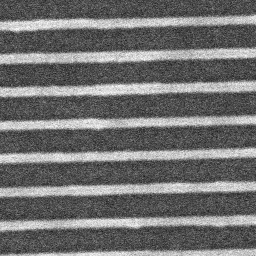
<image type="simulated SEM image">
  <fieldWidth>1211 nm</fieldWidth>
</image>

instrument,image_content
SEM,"parallel lines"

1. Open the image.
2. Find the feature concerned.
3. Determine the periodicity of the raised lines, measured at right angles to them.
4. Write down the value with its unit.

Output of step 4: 158 nanometers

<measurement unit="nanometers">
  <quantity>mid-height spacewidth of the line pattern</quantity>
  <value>116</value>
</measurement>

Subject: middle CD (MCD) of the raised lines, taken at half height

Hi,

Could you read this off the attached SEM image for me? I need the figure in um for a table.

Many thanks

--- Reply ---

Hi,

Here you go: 0.0402